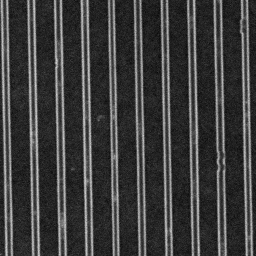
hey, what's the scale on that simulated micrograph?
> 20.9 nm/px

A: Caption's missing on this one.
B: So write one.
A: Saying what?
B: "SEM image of parallel lines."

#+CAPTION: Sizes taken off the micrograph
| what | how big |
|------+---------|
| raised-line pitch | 557 nanometres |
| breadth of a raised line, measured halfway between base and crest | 131 nm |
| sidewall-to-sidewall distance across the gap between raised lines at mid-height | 0.428 um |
